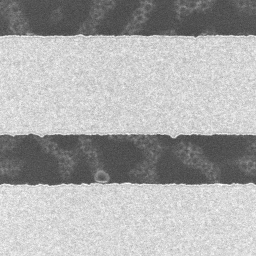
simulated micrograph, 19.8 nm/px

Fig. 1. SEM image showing one or a few lines or trenches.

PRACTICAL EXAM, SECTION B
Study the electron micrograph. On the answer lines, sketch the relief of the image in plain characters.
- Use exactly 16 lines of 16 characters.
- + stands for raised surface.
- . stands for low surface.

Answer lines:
................
................
++++++++++++++++
++++++++++++++++
++++++++++++++++
++++++++++++++++
++++++++++++++++
++++++++++++++++
................
................
................
......++........
++++++++++++++++
++++++++++++++++
++++++++++++++++
++++++++++++++++